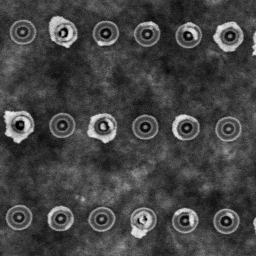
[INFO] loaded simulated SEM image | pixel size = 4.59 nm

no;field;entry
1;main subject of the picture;a regular array of ring-shaped raised bodies with a dot in the middle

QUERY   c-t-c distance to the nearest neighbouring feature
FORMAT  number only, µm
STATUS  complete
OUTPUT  0.187